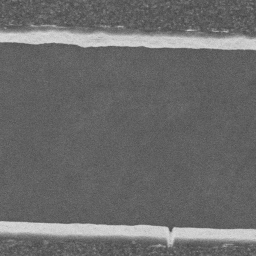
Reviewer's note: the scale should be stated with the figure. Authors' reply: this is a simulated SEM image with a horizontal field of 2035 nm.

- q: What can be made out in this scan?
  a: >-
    one or a few lines or trenches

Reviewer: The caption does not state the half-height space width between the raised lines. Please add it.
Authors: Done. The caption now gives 1510 nm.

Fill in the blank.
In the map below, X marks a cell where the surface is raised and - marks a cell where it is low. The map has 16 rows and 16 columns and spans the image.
XXXXXXXXXXXXXXXX
XXXXXXXXXXXXXXXX
-----XXXXXXXXXXX
----------------
----------------
----------------
----------------
----------------
----------------
----------------
----------------
----------------
----------------
----------------
XXXXXXXXXX------
XXXXXXXXXXXXXXXX